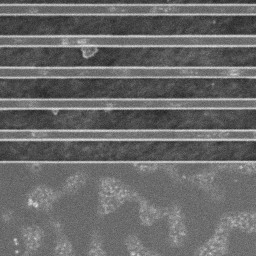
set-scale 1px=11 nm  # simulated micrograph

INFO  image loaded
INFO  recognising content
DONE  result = parallel lines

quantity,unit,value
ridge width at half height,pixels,10.8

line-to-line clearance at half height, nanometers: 228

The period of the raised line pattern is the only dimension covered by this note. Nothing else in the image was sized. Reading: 346 nm